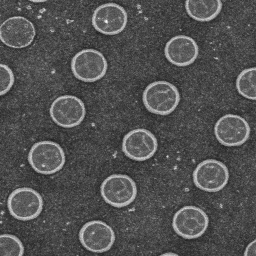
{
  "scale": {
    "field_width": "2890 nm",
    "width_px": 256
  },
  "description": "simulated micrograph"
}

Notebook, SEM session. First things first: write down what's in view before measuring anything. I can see a regular array of raised bodies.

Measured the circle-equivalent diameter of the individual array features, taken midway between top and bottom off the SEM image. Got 358 nanometers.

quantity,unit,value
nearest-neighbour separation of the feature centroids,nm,573